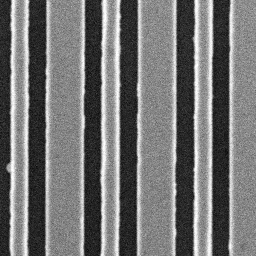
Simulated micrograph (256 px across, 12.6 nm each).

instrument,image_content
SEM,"lines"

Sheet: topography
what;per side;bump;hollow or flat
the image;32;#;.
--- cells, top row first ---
..#...#####..##..#####..##...###
..#...#####..##..#####..##...###
..#...#####..##..#####..##...###
..#...#####..##..#####..##...###
..#...#####..##..#####..##...###
..#...#####..##..#####..##...###
..#...#####..##..#####..##...###
.##...#####..##..#####..##...###
.##...#####..##..#####..##...###
.##...#####..##..#####..##...###
.##...#####..##..#####..##...###
..#...#####..##..#####..##...###
..#...####...##..#####..##...###
.##...####...##..#####..##...###
.##...#####..##..#####..##...###
.##...#####..##..#####..##...###
.##...####...##..#####..##...###
.##...####...##..#####..##...###
.##...####...##..#####..##...###
..#...####...##..#####..##...###
.##...####...##..#####..##...###
.##...####...##..#####..##...###
.##...####...##..#####..##...###
.##...####...##..#####..##...###
.##...####...##..#####..##...###
.##...####...##..#####..##...###
.##...####...##..#####..##...###
.##...####...##..#####..##...###
.##...####...##..#####..##...###
.##...####...##..#####..##...###
.##...####...##..#####..##...###
.##...####...##..#####..##...###